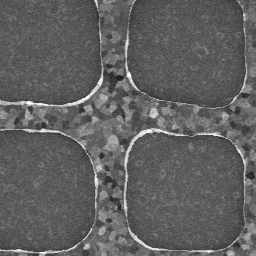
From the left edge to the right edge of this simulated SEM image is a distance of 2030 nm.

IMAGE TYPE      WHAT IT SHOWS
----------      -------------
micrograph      holes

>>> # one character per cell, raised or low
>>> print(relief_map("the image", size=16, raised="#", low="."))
......##.......#
......##.......#
......##.......#
......##.......#
......##.......#
......###......#
###.########..##
################
....#####.....##
.....###.......#
......##.......#
......##.......#
......##.......#
......##.......#
......##.......#
....#####.....##